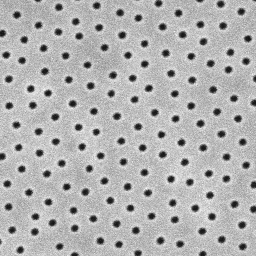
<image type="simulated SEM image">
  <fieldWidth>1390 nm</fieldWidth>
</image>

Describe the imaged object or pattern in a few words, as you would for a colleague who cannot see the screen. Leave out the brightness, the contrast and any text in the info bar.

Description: a regular array of holes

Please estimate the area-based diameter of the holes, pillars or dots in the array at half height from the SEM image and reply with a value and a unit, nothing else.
8.38 px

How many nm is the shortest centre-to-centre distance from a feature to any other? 110